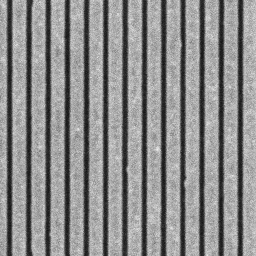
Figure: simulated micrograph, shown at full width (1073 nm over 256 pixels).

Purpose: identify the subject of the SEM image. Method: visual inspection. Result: parallel lines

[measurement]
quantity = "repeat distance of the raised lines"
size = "80.6 nanometres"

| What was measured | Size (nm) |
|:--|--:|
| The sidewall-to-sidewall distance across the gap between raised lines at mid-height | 23.6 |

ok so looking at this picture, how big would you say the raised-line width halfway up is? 0.055 um